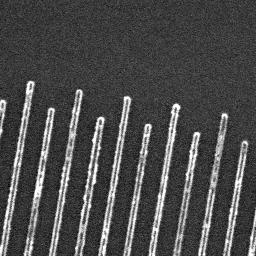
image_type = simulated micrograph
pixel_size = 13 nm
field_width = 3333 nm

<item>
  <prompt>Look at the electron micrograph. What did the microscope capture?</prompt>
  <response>parallel lines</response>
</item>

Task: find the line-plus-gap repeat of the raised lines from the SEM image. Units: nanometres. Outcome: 320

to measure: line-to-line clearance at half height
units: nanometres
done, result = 255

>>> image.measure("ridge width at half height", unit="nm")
64.2